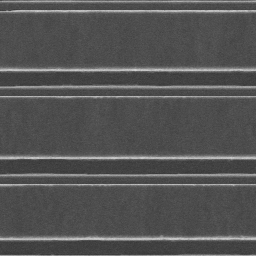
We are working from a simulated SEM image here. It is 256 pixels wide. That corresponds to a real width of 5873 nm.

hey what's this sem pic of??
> lines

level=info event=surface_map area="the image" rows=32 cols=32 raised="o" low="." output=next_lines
................................
oooooooooooooooooooooooooooooooo
oooooooooooooooooooooooooooooooo
oooooooooooooooooooooooooooooooo
oooooooooooooooooooooooooooooooo
oooooooooooooooooooooooooooooooo
oooooooooooooooooooooooooooooooo
oooooooooooooooooooooooooooooooo
oooooooooooooooooooooooooooooooo
................................
................................
................................
oooooooooooooooooooooooooooooooo
oooooooooooooooooooooooooooooooo
oooooooooooooooooooooooooooooooo
oooooooooooooooooooooooooooooooo
oooooooooooooooooooooooooooooooo
oooooooooooooooooooooooooooooooo
oooooooooooooooooooooooooooooooo
oooooooooooooooooooooooooooooooo
................................
................................
................................
oooooooooooooooooooooooooooooooo
oooooooooooooooooooooooooooooooo
oooooooooooooooooooooooooooooooo
oooooooooooooooooooooooooooooooo
oooooooooooooooooooooooooooooooo
oooooooooooooooooooooooooooooooo
oooooooooooooooooooooooooooooooo
................................
................................